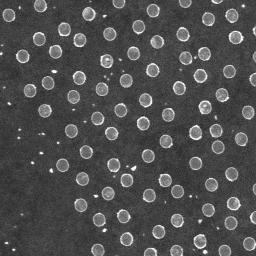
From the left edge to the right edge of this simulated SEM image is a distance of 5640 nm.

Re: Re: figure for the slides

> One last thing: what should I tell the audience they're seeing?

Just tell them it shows a regular array of raised bodies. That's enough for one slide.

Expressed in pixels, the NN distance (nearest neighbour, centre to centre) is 23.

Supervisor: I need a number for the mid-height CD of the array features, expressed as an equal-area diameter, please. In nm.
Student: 276